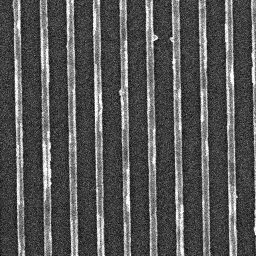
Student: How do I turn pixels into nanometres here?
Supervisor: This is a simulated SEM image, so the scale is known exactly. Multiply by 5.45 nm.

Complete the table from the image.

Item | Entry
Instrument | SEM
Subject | parallel lines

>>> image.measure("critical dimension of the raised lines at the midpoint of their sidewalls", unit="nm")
35.4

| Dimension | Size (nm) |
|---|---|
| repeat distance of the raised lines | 144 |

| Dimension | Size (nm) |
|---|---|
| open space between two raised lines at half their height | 112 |